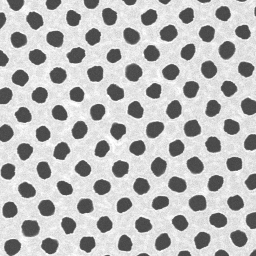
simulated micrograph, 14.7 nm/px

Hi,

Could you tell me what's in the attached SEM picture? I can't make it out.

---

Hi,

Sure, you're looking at a regular array of holes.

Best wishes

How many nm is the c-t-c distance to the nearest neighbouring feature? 377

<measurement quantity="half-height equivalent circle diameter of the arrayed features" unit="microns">0.235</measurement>